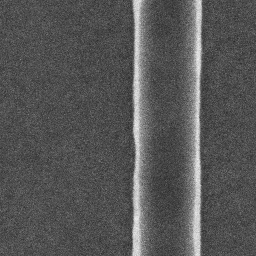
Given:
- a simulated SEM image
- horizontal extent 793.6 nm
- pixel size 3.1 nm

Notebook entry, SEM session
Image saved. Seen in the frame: one or a few lines or trenches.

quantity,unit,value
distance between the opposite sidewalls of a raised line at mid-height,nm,191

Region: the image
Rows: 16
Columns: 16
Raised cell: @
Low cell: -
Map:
---------@@@----
---------@@@----
---------@@@----
---------@@@----
--------@@@@----
---------@@@----
---------@@@----
---------@@@----
---------@@@----
---------@@@----
---------@@@----
---------@@@----
---------@@@----
---------@@@----
--------@@@@----
--------@@@@----